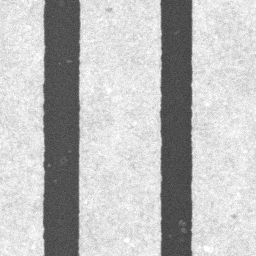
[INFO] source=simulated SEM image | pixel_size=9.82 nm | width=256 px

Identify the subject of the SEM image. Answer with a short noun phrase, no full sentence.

lines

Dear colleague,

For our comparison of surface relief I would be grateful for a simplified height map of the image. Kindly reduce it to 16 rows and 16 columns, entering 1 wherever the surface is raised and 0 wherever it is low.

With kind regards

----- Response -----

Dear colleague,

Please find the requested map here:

1110011111001111
1110011111001111
1110011111001111
1110011111001111
1110011111001111
1110011111001111
1110011111001111
1110011111001111
1110011111001111
1110011111001111
1110011111001111
1110011111001111
1110011111001111
1110011111001111
1110011111001111
1110011111001111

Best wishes